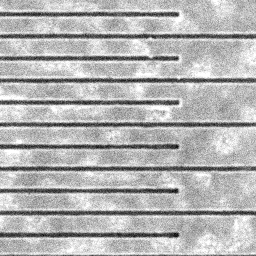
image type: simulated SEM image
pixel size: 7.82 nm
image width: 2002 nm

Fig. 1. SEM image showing parallel lines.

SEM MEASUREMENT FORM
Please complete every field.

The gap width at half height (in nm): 48.9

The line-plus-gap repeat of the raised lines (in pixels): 22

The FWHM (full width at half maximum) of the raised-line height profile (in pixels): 16.2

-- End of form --